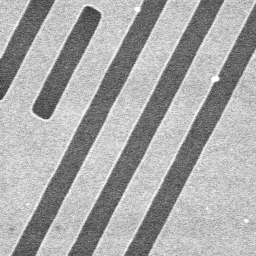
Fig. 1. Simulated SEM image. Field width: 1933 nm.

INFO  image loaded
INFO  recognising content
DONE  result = groups of lines, slits or small figures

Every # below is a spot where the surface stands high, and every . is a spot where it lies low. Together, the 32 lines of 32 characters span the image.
####...###########...####...####
###...####..#####...####...####.
##....####...####...####...####.
##...####...####...####...####..
#...####....####...####...####..
#...####...####...####...####...
...####....####...####...####...
...####...####...####...####...#
..####....###....####...####...#
..####...####...####...####...##
.####....###....####...####...##
.####...####...####...####...###
####...####....###....####...###
####...####...####...####...####
#####.####...####....###....####
##########...####...####...#####
#########...####....###....#####
#########...####...####...######
########...####...####...#######
########...####...####...#######
#######...####...####...########
#######...####...####...########
######...####...####...#########
######...####...####...#########
#####...####...####...##########
#####...####...####...##########
####...####...####...###########
####...####...####...###########
###...####...####...############
###...####...####...############
##...####...####...#############
##...####...####...#############